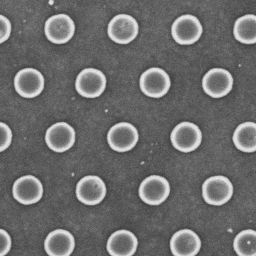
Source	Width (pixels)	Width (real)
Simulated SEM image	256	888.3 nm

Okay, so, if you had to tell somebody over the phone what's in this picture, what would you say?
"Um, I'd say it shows a regular array of raised bodies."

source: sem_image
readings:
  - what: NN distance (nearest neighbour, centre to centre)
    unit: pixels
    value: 61.7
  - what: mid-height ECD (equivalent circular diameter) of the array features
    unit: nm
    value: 96.3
